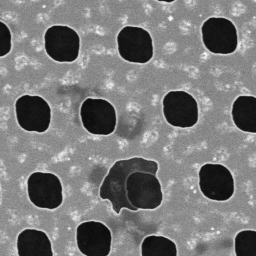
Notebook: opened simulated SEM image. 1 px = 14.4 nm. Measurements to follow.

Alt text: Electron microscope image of a regular array of holes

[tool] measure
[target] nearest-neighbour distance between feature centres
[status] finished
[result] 1080 nanometers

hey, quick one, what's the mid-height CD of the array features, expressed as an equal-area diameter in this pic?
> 532 nanometers